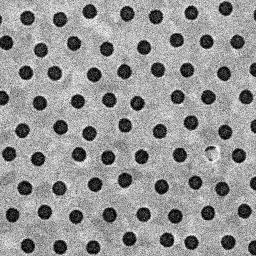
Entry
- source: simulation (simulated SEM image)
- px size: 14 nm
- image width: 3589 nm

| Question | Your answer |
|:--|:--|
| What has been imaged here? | a regular array of holes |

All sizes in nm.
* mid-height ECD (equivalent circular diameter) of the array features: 220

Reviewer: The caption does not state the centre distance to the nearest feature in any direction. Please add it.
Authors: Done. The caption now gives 0.404 microns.